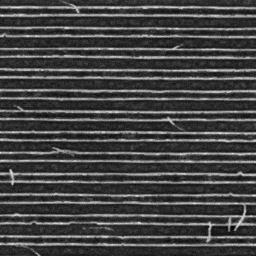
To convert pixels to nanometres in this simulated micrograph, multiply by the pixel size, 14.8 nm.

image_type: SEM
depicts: parallel lines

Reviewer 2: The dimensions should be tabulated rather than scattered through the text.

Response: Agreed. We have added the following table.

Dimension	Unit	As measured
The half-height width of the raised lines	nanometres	136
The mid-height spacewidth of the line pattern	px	12.1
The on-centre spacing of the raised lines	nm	307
